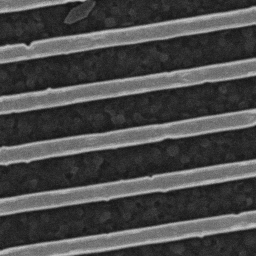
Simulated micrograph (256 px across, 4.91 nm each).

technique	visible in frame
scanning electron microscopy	parallel lines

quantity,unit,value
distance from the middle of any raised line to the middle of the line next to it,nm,246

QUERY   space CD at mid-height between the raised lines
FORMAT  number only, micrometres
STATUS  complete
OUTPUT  0.169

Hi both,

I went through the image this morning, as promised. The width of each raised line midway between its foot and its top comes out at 75.9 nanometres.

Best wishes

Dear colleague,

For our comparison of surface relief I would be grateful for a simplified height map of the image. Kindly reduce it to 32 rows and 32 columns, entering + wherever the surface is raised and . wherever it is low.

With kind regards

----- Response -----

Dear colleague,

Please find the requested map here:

+++++++.........................
+............................+++
......................++++++++++
................+++++++++++++...
.........+++++++++++++..........
....++++++++++++................
+++++++++.......................
+++............................+
.........................+++++++
..................+++++++++++++.
...........+++++++++++++........
.....+++++++++++++..............
+++++++++++.....................
+++++...........................
...........................+++++
.....................+++++++++++
..............++++++++++++......
.......+++++++++++++............
++++++++++++++..................
+++++++.........................
+............................+++
.......................+++++++++
................+++++++++++++...
..........++++++++++++..........
...+++++++++++++................
+++++++++.......................
++.............................+
.........................+++++++
..................+++++++++++++.
............+++++++++++++.......
....++++++++++++++..............
+++++++++++.....................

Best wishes